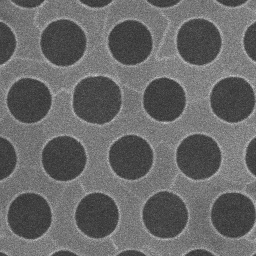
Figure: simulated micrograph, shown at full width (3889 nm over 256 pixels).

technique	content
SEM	a regular array of holes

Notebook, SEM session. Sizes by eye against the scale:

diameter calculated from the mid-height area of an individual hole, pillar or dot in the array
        698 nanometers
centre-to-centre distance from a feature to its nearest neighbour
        1010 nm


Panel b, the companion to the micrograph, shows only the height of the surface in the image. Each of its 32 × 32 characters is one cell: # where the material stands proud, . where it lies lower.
##...#####....#####...######..##
################################
#######..###############..######
.#####....####....#####....####.
..###......###.....###......###.
..###......##......###......##..
..###......###.....###.....####.
.#####....#####...#####....#####
################################
############.###################
##....####.....####...#####....#
#.....###......###.....###......
#......##......###.....###......
#.....###......###.....###......
##....####....#####...#####....#
###.########.###################
################################
.#####....#####...#####....####.
..###.....####.....###.....####.
..###......###.....###......###.
..###......###.....###......###.
..####....####.....####....####.
#######..#######.###############
################################
##...######...#####...#####....#
#.....####....####.....####.....
#.....###......###......##......
#......##......###.....###......
#.....####....####.....####.....
##...######..######...######..##
################################
#######..######...######..######